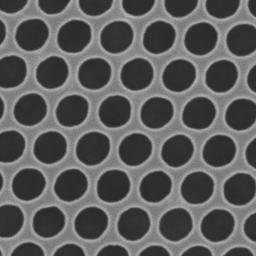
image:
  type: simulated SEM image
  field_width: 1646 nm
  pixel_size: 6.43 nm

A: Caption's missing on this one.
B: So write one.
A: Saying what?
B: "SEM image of a regular array of holes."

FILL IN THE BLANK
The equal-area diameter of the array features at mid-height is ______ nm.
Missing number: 212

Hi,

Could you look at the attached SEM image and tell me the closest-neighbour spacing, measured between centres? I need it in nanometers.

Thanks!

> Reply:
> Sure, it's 271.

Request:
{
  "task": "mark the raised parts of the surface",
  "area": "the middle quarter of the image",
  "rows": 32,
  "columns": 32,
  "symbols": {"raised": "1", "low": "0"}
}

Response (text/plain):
01110000000011100000001111000000
01110000000011000000001110000000
01100000000011000000001110000000
01110000000011000000001110000000
11110000000111000000001110000000
11111000001111100000011110000000
11111111111111110001111111000011
11111111111111111111111111111111
00000111111000011111110001111111
00000011100000001111000000011110
00000011100000000111000000011100
00000011100000000110000000011100
00000011000000000110000000011100
00000111100000000110000000011100
00000111100000001110000000111100
00111111111000111111000001111100
11111111111111111111111111111111
11111000001111111000111111111111
11110000000111100000011111000001
01110000000011000000001110000000
01100000000011000000001110000000
01100000000011000000001100000000
11100000000111000000001100000000
11100000001111000000011110000000
11111000011111100000111110000001
11111111111111111011111111000111
10001111111000111111111111111111
00000111110000001111100000111110
00000011100000001111000000011100
00000011000000001110000000011100
00000011000000000110000000011000
00000011000000000110000000011000